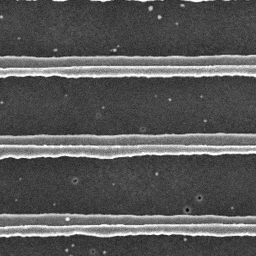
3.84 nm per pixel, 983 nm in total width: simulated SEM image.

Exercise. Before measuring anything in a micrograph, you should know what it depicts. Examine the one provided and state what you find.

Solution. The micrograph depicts lines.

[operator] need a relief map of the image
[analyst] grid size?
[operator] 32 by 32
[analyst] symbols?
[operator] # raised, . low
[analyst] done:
................................
................................
................................
................................
................................
................................
................................
################################
################################
####.#################.####....#
................................
................................
................................
................................
................................
................................
................................
################################
################################
########.########...............
................................
................................
................................
................................
................................
................................
................................
################################
################################
######......###...........###...
................................
................................